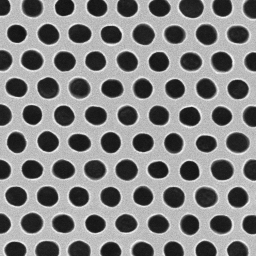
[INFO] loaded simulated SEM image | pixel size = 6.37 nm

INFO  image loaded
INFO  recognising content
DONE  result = a regular array of holes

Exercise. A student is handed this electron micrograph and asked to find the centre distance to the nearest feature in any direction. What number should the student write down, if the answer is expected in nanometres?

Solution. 197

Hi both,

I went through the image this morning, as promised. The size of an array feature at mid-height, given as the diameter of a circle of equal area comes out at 0.129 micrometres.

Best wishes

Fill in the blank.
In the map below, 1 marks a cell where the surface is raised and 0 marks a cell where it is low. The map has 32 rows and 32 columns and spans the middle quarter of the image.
00011100001111000011100000111000
00111110011111100011110001111110
11111111111111111111111111111111
11101111111111111111111111111111
11000011110000111100011111000011
10000001100000011000001110000011
10000001100000011000001110000011
11000011110000111100001111000011
11110111111111111110011111101111
11111111111111111111111111111111
11111110111111100111111011111111
00111100001111000011100000111000
00111000000110000011100000111000
00011000000111000011100000111000
00111100001111000011110000111000
01111111111111111111111111111111
11111111111111111111111111111111
11101111110001111110011111001111
10000011100000111000001110000111
10000001100000111000001110000011
10000001100000111000001110000011
11100111110001111100001111000111
11111111111011111111111111111111
11111111111111111111111111111111
01111100011111000111111001111100
00011000001110000011100000111000
00011000001110000001100000111000
00111000001110000011100000111000
01111100011111000111110001111100
11111111111111111111111111111111
11111111111111111111111111111111
11000111110000111100001110000011